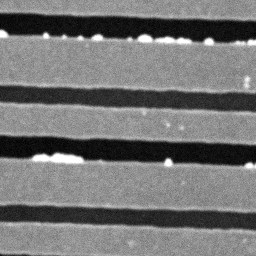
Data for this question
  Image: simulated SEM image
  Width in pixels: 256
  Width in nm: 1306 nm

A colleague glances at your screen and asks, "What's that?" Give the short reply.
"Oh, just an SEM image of lines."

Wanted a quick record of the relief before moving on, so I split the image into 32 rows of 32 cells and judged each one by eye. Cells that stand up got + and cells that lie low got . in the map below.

++++++++++++++++++++++++++++++++
++++++++++++++++++++++++++++++++
................................
................................
+....+..........................
+++++++++++++++++++++++++++.++++
++++++++++++++++++++++++++++++++
++++++++++++++++++++++++++++++++
++++++++++++++++++++++++++++++++
++++++++++++++++++++++++++++++++
++++++++++++++++++++++++++++++++
.........................++++.++
................................
+++++++++++++...................
++++++++++++++++++++++++++++++++
++++++++++++++++++++++++++++++++
++++++++++++++++++++++++++++++++
..................++++++++++++++
................................
....+++++.......................
++++++++++++++++++++++..........
++++++++++++++++++++++++++++++++
++++++++++++++++++++++++++++++++
++++++++++++++++++++++++++++++++
++++++++++++++++++++++++++++++++
+..+++++++++++++++++++++++++++++
..............................+.
................................
++++++++++++++++++++............
++++++++++++++++++++++++++++++++
++++++++++++++++++++++++++++++++
++++++++++++++++++++++++++++++++